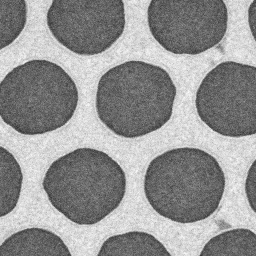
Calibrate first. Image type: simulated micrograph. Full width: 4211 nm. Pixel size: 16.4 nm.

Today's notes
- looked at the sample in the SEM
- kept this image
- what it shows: holes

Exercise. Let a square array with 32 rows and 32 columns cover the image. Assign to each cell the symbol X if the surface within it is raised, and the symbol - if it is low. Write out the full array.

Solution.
---XXX---------XXXX---------XXX-
---XXX----------XX----------XXX-
---XXX----------XX----------XXX-
---XXX----------XXX---------XXX-
--XXXXX--------XXXX---------XXXX
-XXXXXXX------XXXXXX-------XXXXX
XXXXXXXXX----XXXXXXXX----XXXXXXX
XXXX-XXXXXXXXXXXXXXXXXXXXXXXXXXX
XX------XXXXXX------XXXXXXX-----
X--------XXXX--------XXXXX------
---------XXX----------XXX-------
----------XX----------XXX-------
----------XX----------XX--------
---------XXX----------XXX-------
---------XXX---------XXXX-------
X-------XXXXX--------XXXXX------
XX----XXXXXXXX-----XXXXXXXX-----
XXXXXXXXXXXXXXXXXXXXXXXXXXXXXXXX
XXXXXXXXXX-XXXXXXXXXXX--XXXXXXXX
--XXXXXX------XXXXXX------XXXXXX
--XXXX---------XXXX--------XXXX-
---XXX----------XX----------XXX-
---XX-----------XX----------XXX-
---XX-----------XX----------XXX-
--XXXX---------XXX----------XXX-
--XXXX---------XXXX--------XXXX-
-XXXXXX-------XXXXXX-------XXXXX
XXXXXXXXX----XXXXXXXX----XXXXXXX
XXXX-XXXXXXXXXXXXXXXXXXXXXXXXXXX
X------XXXXXXX-----XXXXXXXX-----
--------XXXXX-------XXXXXX------
---------XXX---------XXXX-------